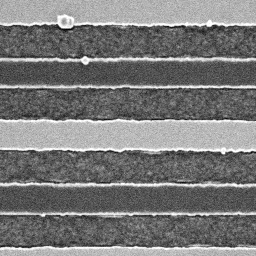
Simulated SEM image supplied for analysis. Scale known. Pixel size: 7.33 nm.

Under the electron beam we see lines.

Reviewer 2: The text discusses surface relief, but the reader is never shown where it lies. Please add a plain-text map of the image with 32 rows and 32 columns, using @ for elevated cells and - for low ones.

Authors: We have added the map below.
@@@@@@@@@@@@@@@@@@@@@@@@@@@@@@@@
@@@@@@@@@@@@@@@@@@@@@@@@@@@@@@@@
@@@@@@@@@@@@@@@@@@@@@@@@@@@@@@@@
--------------------------------
--------------------------------
--------------------------------
--------------------------------
@@@@@@@@@@@@@@@@@@@@@@@@@@@@@@@@
@@@@@@@@@@@@@@@@@@@@@@@@@@@@@@@@
@@@@@@@@@@@@@@@@@@@@@@@@@@@@@@@@
@@@@@@@@@@@@@@@@@@@@@@@@@@@@@@@@
--------------------------------
--------------------------------
--------------------------------
--------------------------------
@@@@@@@@@@@@@@@@@@@@@@@@@@@@@@@@
@@@@@@@@@@@@@@@@@@@@@@@@@@@@@@@@
@@@@@@@@@@@@@@@@@@@@@@@@@@@@@@@@
@@@@@@@@@@@@@@@@@@@@@@@@@@@@@@@@
--------------------------------
--------------------------------
--------------------------------
--------------------------------
@@@@@@@@@@@@@@@@@@@@@@@@@@@@@@@@
@@@@@@@@@@@@@@@@@@@@@@@@@@@@@@@@
@@@@@@@@@@@@@@@@@@@@@@@@@@@@@@@@
@@@@@@@@@@@@@@@@@@@@@@@@@@@@@@@@
--------------------------------
--------------------------------
--------------------------------
--------------------------------
@@@@@@@@@@@@@@@@@@@@@@@@@@@@@@@@